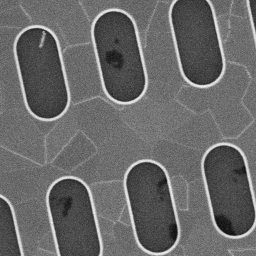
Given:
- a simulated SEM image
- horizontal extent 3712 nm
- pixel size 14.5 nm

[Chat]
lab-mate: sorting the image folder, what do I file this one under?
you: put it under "groups of lines, slits or small figures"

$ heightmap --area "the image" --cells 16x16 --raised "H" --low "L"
HHHHHHHHHHHLLHHH
HHHHHHLLHHHLLHHH
HLLLHHLLLHHLLLHH
HLLLHHLLLHHLLLHH
HLLLHHLLLHHLLLHH
HLLLHHHLLHHHHHHH
HHLLHHHHHHHHHHHH
HHHHHHHHHHHHHHHH
HHHHHHHHHHHHHHHH
HHHHHHHHHHHHHLLH
HHHHHHHHLLHHHLLH
HHHLLHHHLLLHHLLL
HHHLLLHHLLLHHLLL
LHHLLLHHLLLHHLLL
LHHLLLHHLLLHHHLH
LHHHLLHHHLLHHHHH